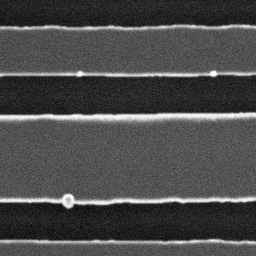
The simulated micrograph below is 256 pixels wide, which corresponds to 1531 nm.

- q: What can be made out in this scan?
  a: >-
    lines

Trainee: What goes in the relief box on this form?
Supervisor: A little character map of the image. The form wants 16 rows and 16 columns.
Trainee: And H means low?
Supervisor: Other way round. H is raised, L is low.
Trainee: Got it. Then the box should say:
LLLLLLLLLLLLLLLL
LLLLLLLLLLLLLLLL
HHHHHHHHHHHHHHHH
HHHHHHHHHHHHHHHH
HHHHHHHHHHHHHHHH
LLLLLLLLLLLLLLLL
LLLLLLLLLLLLLLLL
HHHHHHHHHHHHHHHH
HHHHHHHHHHHHHHHH
HHHHHHHHHHHHHHHH
HHHHHHHHHHHHHHHH
HHHHHHHHHHHHHHHH
HHHHHHHHHHHHHHHH
LLLLLLLLLLLLLLLL
LLLLLLLLLLLLLLLL
HHHHHHHHHHHHHHHH